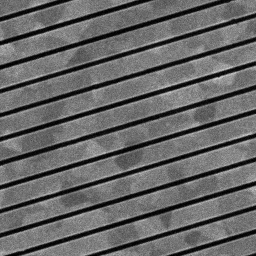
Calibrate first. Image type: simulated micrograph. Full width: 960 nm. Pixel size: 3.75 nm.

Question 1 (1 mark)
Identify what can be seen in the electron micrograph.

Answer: parallel lines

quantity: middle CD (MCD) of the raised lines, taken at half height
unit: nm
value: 67.9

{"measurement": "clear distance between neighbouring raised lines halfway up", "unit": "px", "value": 5.39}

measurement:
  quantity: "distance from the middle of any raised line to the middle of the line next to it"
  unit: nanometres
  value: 86.4